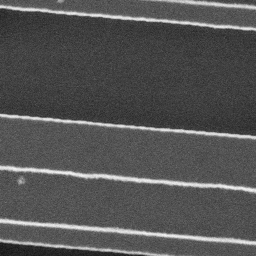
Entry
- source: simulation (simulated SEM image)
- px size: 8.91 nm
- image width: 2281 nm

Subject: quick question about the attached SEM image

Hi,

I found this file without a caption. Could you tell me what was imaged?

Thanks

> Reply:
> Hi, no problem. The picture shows lines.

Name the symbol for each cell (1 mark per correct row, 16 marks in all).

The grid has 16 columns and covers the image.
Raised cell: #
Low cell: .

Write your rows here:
.###############
............####
................
................
................
................
................
####............
###############.
################
################
################
################
################
################
....############